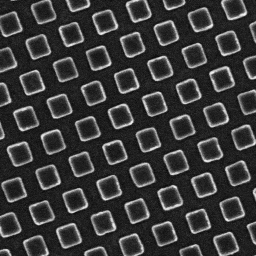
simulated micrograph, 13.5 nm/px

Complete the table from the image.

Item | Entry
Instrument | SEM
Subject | a regular array of raised bodies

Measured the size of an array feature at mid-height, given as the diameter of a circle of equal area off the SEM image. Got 0.312 micrometres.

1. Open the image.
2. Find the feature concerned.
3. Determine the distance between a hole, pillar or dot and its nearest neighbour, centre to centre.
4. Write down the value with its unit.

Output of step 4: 480 nm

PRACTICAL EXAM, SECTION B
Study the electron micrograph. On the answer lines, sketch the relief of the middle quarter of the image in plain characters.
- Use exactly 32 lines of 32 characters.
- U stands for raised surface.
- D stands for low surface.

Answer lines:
UUUDDDDUUUUDDDDDDDDDDUUUUUDDDDDU
UUUDDDDDDDDDDDDUUDDDDUUUUUUDDDDD
UUUDDDDDDDDDDUUUUUDDDDUUUUUDDDDD
UUUDDDDDDDDDDUUUUUDDDDUUUDDDDDDD
DDDDDDDDUDDDDUUUUUDDDDDDDDDDDDUU
DDDDDUUUUDDDDUUUUUUDDDDDDDDDUUUU
DDDDUUUUUUDDDDUUUDDDDDDDDDDDUUUU
DDDDDUUUUUDDDDDDDDDDDDUUDDDDDUUU
UDDDDUUUUUDDDDDDDDDDUUUUUDDDDUUU
UDDDDDUUUDDDDDDDDDDDUUUUUDDDDDUU
UUDDDDDDDDDDDUUUDDDDUUUUUUDDDDDD
UUDDDDDDDDDUUUUUDDDDDUUUUUDDDDDD
UDDDDDDDDDDUUUUUUDDDDUUUDDDDDDDD
DDDDDDUDDDDDUUUUUDDDDDDDDDDDUUUD
DDDUUUUUDDDDUUUUUDDDDDDDDDDUUUUU
DDDUUUUUDDDDUUUDDDDDDDDDDDDUUUUU
DDDUUUUUUDDDDDDDDDDDUUUDDDDUUUUU
DDDDUUUUUDDDDDDDDDUUUUUDDDDDUUUU
DDDDUUUUDDDDDDDDDDUUUUUUDDDDUUDD
DDDDDDDDDDDDUUDDDDDUUUUUDDDDDDDD
DDDDDDDDDDUUUUUDDDDUUUUUDDDDDDDD
DDDDDDDDDDUUUUUDDDDUUUDDDDDDDDDD
DDDDUUDDDDUUUUUUDDDDDDDDDDUUUUDD
DDUUUUDDDDDUUUUUDDDDDDDDDUUUUUDD
DUUUUUUDDDDUUUDDDDDDDDDDDUUUUUUD
DDUUUUUDDDDDDDDDDDUUUDDDDDUUUUUD
DDUUUUUDDDDDDDDDDUUUUUDDDDUUUUUD
DDDUUUDDDDDDDDDDDUUUUUDDDDDDDDDD
DDDDDDDDDDUUUDDDDUUUUUUDDDDDDDDD
DDDDDDDDUUUUUDDDDDUUUUDDDDDDDDDD
DDDDDDDDDUUUUUDDDDUUDDDDDDDUDDDD
DDUUDDDDDUUUUUDDDDDDDDDDUUUUDDDD